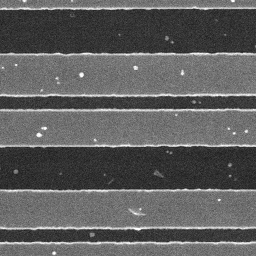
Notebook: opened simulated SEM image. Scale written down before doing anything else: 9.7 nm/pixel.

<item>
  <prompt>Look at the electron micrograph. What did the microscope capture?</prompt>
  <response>lines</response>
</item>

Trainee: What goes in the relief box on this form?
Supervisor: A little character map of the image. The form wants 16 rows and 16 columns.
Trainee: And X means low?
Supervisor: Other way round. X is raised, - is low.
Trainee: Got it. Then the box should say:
XXXXXXXXXXXXXXXX
----------------
----------------
XXXXXXXXXXXXXXXX
XXXXXXXXXXXXXXXX
XXXXXXXXXXXXXXXX
XXXXXXXXXXXXXXXX
XXXXXXXXXXXXXXXX
XXXXXXXXXXXXXXXX
----------------
----------------
----------------
XXXXXXXXXXXXXXXX
XXXXXXXXXXXXXXXX
XXXXXXXXXXXXXXXX
XXXXXXXXXXXXXXXX